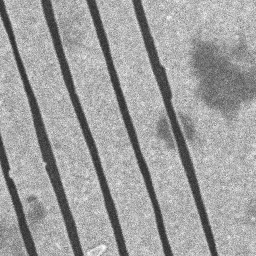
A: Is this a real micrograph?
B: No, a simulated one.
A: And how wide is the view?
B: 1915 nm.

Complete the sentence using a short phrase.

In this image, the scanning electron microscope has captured parallel lines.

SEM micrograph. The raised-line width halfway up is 261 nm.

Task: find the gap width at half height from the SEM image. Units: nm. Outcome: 65.2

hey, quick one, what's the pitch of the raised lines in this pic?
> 326 nanometres